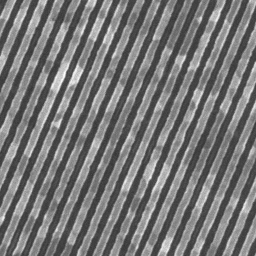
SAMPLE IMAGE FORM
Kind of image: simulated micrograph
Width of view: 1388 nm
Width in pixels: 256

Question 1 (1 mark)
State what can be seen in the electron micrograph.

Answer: parallel lines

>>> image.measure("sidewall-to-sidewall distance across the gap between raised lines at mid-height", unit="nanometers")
44.3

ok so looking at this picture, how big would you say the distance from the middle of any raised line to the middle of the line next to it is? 0.0807 micrometres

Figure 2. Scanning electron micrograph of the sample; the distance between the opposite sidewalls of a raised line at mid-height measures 39.4 nm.